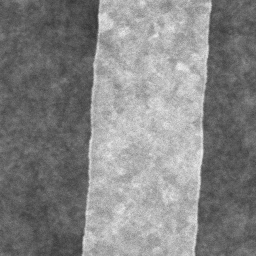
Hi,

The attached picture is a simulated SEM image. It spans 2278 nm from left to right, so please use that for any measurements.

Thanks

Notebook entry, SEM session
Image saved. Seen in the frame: one or a few lines or trenches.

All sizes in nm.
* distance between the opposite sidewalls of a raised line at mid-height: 986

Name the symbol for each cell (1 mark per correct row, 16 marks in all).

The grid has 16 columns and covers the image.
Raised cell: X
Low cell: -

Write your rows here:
------XXXXXXX---
------XXXXXXX---
------XXXXXXX---
------XXXXXXX---
------XXXXXXX---
------XXXXXXX---
------XXXXXXX---
------XXXXXXX---
------XXXXXXX---
------XXXXXXX---
------XXXXXXX---
------XXXXXX----
-----XXXXXXX----
-----XXXXXXX----
-----XXXXXXX----
-----XXXXXXX----